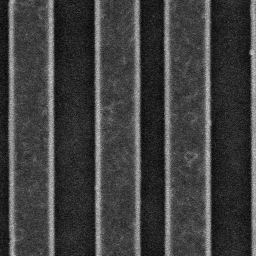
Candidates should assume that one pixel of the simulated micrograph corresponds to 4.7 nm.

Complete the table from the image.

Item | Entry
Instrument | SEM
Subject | one or a few lines or trenches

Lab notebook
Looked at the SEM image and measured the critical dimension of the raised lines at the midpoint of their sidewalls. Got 191 nanometres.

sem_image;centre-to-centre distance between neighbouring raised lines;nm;367